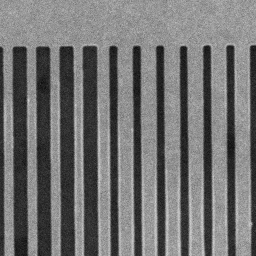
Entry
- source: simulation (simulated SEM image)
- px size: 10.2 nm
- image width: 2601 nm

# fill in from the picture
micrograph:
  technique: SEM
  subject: groups of lines, slits or small figures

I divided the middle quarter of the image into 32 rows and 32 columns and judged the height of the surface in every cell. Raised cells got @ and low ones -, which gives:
---@@---@@@---@@@--@@@@--@@@@--@
---@@---@@@---@@@--@@@@--@@@@--@
---@@---@@@---@@@--@@@@--@@@@--@
---@@---@@@---@@@--@@@@--@@@@--@
---@@---@@@---@@@--@@@@--@@@@--@
---@@---@@@---@@@--@@@@--@@@@--@
---@@----@@---@@@--@@@@--@@@@--@
---@@----@@---@@@--@@@@--@@@@--@
---@@----@@---@@@--@@@@--@@@@--@
---@@----@@---@@@--@@@@--@@@@--@
---@@----@@---@@@--@@@@--@@@@--@
---@@----@@---@@@--@@@@--@@@@--@
---@@----@@---@@@--@@@@--@@@@--@
---@@----@@---@@@--@@@@--@@@@--@
---@@----@@---@@@--@@@@--@@@@--@
---@@----@@---@@@--@@@@--@@@@--@
---@@----@@---@@@---@@@--@@@@--@
---@@----@@---@@@---@@@--@@@@--@
---@@----@@---@@@---@@@--@@@@--@
---@@----@@---@@@---@@@--@@@@--@
---@@----@@---@@@---@@@--@@@@--@
---@@----@@---@@@---@@@--@@@@--@
---@@----@@---@@@---@@@--@@@@--@
---@@----@@---@@@---@@@--@@@@--@
---@@----@@---@@@---@@@--@@@@--@
---@@----@@---@@@---@@@---@@@--@
---@@----@@---@@@---@@@---@@@--@
---@@----@@---@@@---@@@---@@@--@
---@@----@@---@@@---@@@---@@@--@
---@@----@@---@@@---@@@---@@@--@
---@@----@@---@@@---@@@---@@@--@
---@@----@@---@@@---@@@---@@@--@